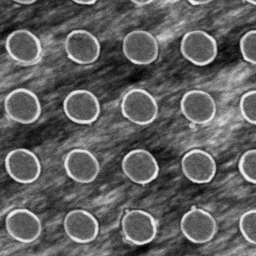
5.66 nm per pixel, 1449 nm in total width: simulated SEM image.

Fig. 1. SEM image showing a regular array of raised bodies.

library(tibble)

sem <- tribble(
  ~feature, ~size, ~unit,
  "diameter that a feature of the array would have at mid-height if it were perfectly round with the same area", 194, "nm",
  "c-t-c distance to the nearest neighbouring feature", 330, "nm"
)